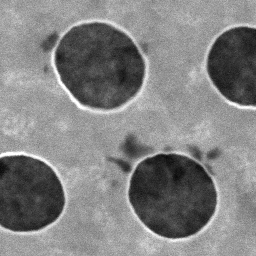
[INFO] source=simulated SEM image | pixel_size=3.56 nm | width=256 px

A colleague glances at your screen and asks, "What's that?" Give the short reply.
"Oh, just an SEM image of holes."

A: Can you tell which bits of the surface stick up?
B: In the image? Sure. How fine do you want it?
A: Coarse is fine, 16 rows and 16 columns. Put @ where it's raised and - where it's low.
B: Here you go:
@@@@@@@@@@@@@@@@
@@@@@--@@@@@@@@@
@@@@----@@@@@@--
@@@------@@@@---
@@@@-----@@@@---
@@@@-----@@@@@--
@@@@@---@@@@@@@-
@@@@@@@@@@@@@@@@
@@@@@@@@@@@@@@@@
@@@@@@@@@@@@@@@@
---@@@@@@----@@@
----@@@@-----@@@
----@@@@------@@
----@@@@@----@@@
@@@@@@@@@@--@@@@
@@@@@@@@@@@@@@@@